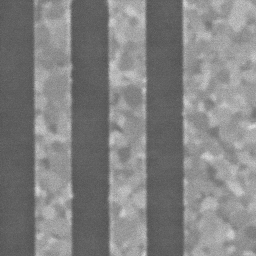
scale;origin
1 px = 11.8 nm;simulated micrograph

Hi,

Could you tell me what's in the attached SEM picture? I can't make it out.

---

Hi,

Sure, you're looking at one or a few lines or trenches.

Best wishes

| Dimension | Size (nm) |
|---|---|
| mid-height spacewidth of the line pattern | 459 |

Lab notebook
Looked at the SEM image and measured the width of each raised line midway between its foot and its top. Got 416 nanometres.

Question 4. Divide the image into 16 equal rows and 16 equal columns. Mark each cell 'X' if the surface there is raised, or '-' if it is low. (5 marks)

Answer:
--XX---XX---XXXX
--XX---XX--XXXXX
--XX---XX---XXXX
--XX---XX---XXXX
--XX---XX--XXXXX
--XX---XX---XXXX
--XX---XX---XXXX
--XX---XX--XXXXX
--XX---XX---XXXX
--XX---XX---XXXX
--XX---XX---XXXX
--XX---XX---XXXX
--XX---XX---XXXX
--XX---XX---XXXX
--XX---XX---XXXX
--XX---XX---XXXX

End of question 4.